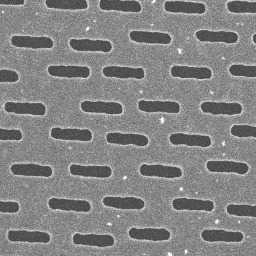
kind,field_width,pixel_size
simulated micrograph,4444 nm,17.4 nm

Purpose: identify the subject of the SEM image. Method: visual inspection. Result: a regular array of holes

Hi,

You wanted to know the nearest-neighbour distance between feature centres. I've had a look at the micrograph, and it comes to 742 nm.